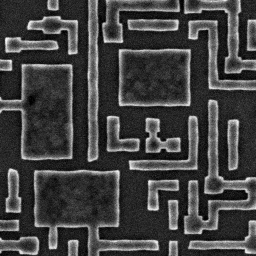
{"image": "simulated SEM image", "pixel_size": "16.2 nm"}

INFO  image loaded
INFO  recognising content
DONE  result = wiring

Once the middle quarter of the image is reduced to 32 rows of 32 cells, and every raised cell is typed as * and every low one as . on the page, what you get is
**....**......*****************.
**....**......*****************.
**....**......*****************.
**....**......*****************.
**....**......*****************.
**....**......*****************.
**....**......*****************.
**....**......*****************.
**....**......*****************.
**....**......*****************.
**....**........................
**....**........................
**....**........................
**....**...***.................*
**....**...***.......***.......*
**....**...***.......***.......*
**....**...***.......***.......*
**....**...***.......**........*
**....**...***.......***.......*
**....**...********..********..*
**....**...********..********..*
**....**...********..***..***..*
**....**.......................*
**....**.......................*
................****************
.................***************
................................
**************..................
**************..................
**************.......********..*
**************.......********..*
**************.......***.......*